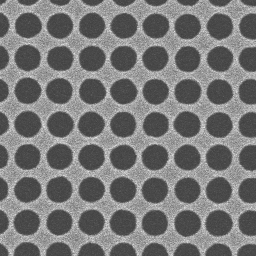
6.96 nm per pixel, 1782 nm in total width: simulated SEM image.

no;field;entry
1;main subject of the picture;a regular array of holes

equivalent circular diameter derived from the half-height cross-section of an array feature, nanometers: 184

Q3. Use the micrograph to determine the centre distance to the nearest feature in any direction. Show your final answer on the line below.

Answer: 31.8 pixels